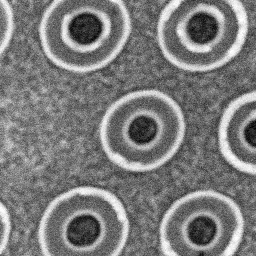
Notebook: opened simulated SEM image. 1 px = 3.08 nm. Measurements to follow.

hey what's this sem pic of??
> ring-shaped raised bodies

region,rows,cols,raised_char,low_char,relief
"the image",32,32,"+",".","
+......++++++++......+++++++++..
+.....++++.+++++....+++++.++++..
+....++++....+++....+++....++++.
+....+++.....+++....+++.....+++.
+....++++....+++....+++....++++.
+.....++++.++++.....++++..++++..
......+++++++++......+++++++++..
.......+++++++.......+++++++....
.........+++...........+++......
................................
................................
..................+.............
...............++++++.........++
..............++++++++.......+++
.............++++..++++.....++++
.............+++....+++.....+++.
.............+++....+++.....++..
.............+++...+++......++..
.............+++++++++......+++.
..............+++++++.......++++
...............+++++.........+++
................................
................................
................................
........++++++..........++++....
.......++++++++.......+++++++...
+.....+++++++++......+++++++++..
+....++++...++++.....+++...+++..
+....+++.....+++....+++....+++..
+....+++.....+++....+++....+++..
+....++++...+++.....++++..++++..
......+++++++++......++++++++...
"